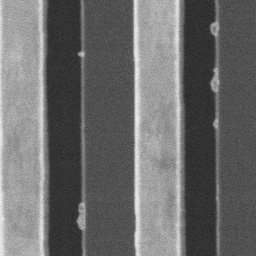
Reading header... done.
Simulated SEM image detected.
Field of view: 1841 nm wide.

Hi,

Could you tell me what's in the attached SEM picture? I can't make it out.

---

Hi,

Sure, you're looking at lines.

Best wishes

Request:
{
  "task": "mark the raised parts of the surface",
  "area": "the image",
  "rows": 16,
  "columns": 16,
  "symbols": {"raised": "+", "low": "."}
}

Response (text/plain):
+++..++++++...++
+++..++++++..+++
+++..++++++..+++
+++..++++++...++
+++..++++++..+++
+++..++++++..+++
+++..++++++...++
+++..++++++..+++
+++..++++++...++
+++..++++++...++
+++..++++++...++
+++..++++++...++
+++..++++++...++
+++..++++++...++
+++..++++++...++
+++..++++++...++